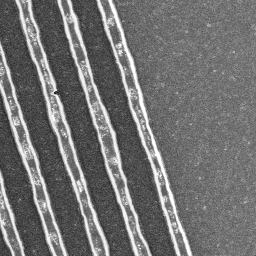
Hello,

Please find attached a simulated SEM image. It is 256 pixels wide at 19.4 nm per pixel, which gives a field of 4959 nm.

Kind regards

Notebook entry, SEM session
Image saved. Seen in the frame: parallel lines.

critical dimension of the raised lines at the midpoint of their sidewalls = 10.6 px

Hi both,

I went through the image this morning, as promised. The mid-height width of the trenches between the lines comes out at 564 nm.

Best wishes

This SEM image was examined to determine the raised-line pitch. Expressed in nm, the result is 770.